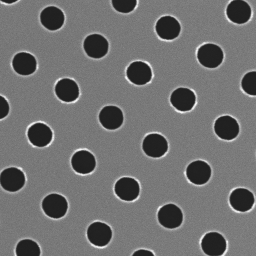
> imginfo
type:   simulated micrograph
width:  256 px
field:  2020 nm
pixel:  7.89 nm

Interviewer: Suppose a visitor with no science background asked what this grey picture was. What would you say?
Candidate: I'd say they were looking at a regular array of holes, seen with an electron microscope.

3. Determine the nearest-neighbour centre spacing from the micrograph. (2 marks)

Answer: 404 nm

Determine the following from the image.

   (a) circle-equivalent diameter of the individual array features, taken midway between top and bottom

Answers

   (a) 190 nm